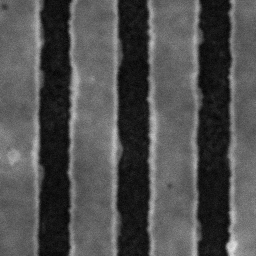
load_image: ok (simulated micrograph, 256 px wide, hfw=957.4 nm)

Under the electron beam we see lines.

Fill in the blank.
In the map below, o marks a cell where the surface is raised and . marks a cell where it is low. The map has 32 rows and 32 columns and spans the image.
ooooo....oooooo...ooooooo....ooo
ooooo....oooooo....oooooo....ooo
ooooo....oooooo....oooooo....ooo
ooooo....oooooo....oooooo....ooo
ooooo....oooooo....oooooo....ooo
ooooo....oooooo....oooooo....ooo
ooooo....oooooo....oooooo....ooo
ooooo....oooooo....oooooo....ooo
ooooo....oooooo....oooooo....ooo
ooooo....oooooo....oooooo....ooo
ooooo....oooooo....oooooo....ooo
ooooo....oooooo....oooooo....ooo
ooooo....oooooo....oooooo....ooo
ooooo....oooooo....oooooo....ooo
ooooo....oooooo....oooooo....ooo
ooooo....oooooo....oooooo....ooo
ooooo....oooooo....oooooo....ooo
ooooo....oooooo....oooooo....ooo
ooooo....oooooo....oooooo....ooo
ooooo....oooooo....oooooo....ooo
ooooo....oooooo....oooooo....ooo
ooooo....oooooo....oooooo....ooo
ooooo....oooooo....oooooo....ooo
ooooo....oooooo....oooooo....ooo
ooooo....oooooo....oooooo....ooo
ooooo....oooooo....oooooo....ooo
ooooo....oooooo....oooooo....ooo
ooooo....oooooo....oooooo....ooo
ooooo....oooooo....oooooo....ooo
ooooo....oooooo....oooooo....ooo
ooooo....oooooo....oooooo...oooo
ooooo....oooooo....oooooo...oooo